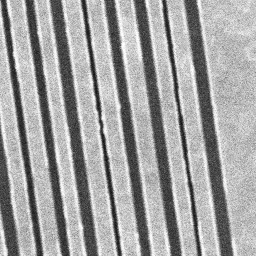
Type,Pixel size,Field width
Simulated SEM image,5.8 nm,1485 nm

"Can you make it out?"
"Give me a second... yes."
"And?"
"parallel lines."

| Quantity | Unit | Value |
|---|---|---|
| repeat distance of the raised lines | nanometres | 151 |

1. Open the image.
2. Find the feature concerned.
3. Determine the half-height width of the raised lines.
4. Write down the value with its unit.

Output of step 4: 104 nanometers